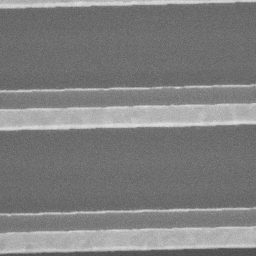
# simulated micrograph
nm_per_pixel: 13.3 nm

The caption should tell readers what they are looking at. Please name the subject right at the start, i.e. lines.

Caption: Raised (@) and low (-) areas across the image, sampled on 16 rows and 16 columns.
----------------
----------------
----------------
----------------
----------------
----------@@@@@@
@@@@@@@@@@@@@@@@
@@@@@@@@@@@@@@@@
----------------
----------------
----------------
----------------
----------------
@@@@@@@@@@@@@@@@
@@@@@@@@@@@@@@@@
@@@@@@@@@@@@@---